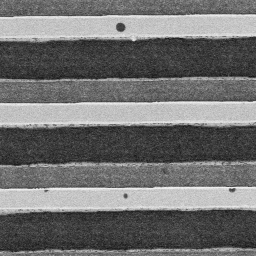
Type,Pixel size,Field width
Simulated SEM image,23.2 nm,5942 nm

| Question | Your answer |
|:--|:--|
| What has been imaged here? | lines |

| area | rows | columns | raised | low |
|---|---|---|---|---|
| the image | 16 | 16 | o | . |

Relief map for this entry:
oooooooooooooooo
oooooooooooooooo
................
................
................
oooooooooooooooo
oooooooooooooooo
oooooooooooooooo
................
................
oooooooooooooooo
oooooooooooooooo
oooooooooooooooo
................
................
................